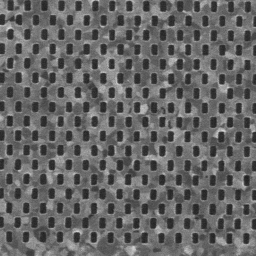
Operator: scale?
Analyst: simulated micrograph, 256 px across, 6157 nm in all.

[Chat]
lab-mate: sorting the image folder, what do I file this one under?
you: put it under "a regular array of holes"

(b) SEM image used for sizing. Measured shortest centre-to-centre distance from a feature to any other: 397 nm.